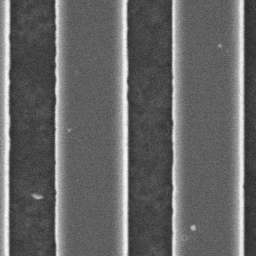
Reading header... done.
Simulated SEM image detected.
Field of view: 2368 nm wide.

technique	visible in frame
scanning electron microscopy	lines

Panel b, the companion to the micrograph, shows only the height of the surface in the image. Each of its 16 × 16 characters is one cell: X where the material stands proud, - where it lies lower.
X--XXXXX---XXXX-
X--XXXXX---XXXX-
X--XXXXX---XXXX-
X--XXXXX---XXXX-
X--XXXXX---XXXX-
X--XXXXX---XXXX-
X--XXXXX---XXXX-
X--XXXXX---XXXX-
X--XXXXX---XXXX-
X--XXXXX---XXXX-
X--XXXXX---XXXX-
X--XXXXX---XXXX-
X--XXXXX---XXXX-
---XXXXX---XXXX-
---XXXXX---XXXX-
X--XXXXX---XXXX-